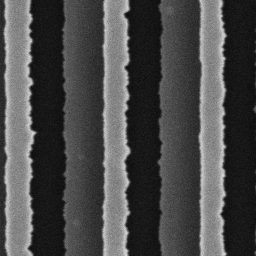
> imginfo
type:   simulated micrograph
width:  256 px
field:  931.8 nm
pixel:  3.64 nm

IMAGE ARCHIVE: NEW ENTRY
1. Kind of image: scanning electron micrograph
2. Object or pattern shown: lines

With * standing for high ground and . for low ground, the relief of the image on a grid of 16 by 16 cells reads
**..****..****..
**..****..****..
**..****..****..
**..****..****..
**..****..****..
**..****..****..
**..****..****..
**..****..****..
**..****..****..
**..****..****..
**..****..****..
**..****..****..
**..****..****..
**..****..****..
**..****..****..
**..****..****..